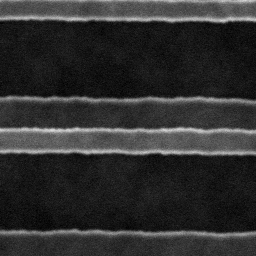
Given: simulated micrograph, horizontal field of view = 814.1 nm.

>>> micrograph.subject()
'lines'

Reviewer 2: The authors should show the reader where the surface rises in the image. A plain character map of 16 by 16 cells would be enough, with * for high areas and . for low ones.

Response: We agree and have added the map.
****************
................
................
................
................
................
****************
****************
****************
****************
................
................
................
................
**.****.........
****************